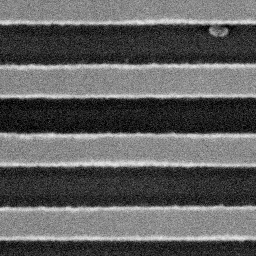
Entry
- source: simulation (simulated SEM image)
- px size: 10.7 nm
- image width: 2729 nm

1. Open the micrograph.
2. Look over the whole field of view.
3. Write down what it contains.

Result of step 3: lines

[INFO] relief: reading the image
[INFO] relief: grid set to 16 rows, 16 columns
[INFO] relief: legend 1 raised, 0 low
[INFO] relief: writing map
1111111111111111
1000100000000000
0000000000000000
0000000000000000
1111111111111111
1111111111111111
0000000000000000
0000000000000000
1111111111111111
1111111111111111
0000000000000000
0000000000000000
0000000000000000
1111111111111111
1111111111111111
0000000000000000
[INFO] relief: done